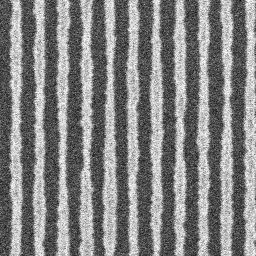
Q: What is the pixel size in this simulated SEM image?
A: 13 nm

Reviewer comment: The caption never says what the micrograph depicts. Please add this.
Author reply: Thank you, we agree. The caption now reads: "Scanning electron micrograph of parallel lines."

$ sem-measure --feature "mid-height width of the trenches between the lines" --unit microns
0.216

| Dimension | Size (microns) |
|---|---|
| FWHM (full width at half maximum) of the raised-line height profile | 0.0909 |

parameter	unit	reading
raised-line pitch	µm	0.304